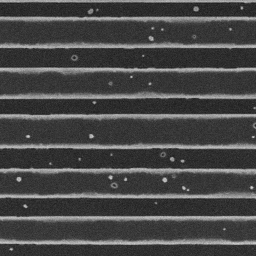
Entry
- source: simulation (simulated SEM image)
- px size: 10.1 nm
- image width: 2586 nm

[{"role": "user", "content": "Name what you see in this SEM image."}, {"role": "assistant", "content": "lines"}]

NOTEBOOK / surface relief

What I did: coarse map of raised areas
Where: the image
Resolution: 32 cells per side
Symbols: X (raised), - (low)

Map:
--------------------------------
--------------------------------
XXXXXXXXXXXXXXXXXXXXXXXXXXXXXXXX
XXXXXXXXXXXXXXXXXXXXXXXXXXXXXXXX
XXXXXXXXXXXXXXXXXXXXXXXXXXXXXXXX
XXXXXXXXXXXXXXXXXXXXXXXXXXXXXXXX
--------------------------------
--------------------------------
--------------------------------
XXXXXXXXXXXXXXXXXXXXXXXXXXXXXXXX
XXXXXXXXXXXXXXXXXXXXXXXXXXXXXXXX
XXXXXXXXXXXXXXXXXXXXXXXXXXXXXXXX
--------------------------------
--------------------------------
X--------X----XXXX--XXXXXXXXXXXX
XXXXXXXXXXXXXXXXXXXXXXXXXXXXXXXX
XXXXXXXXXXXXXXXXXXXXXXXXXXXXXXXX
XXXXXXXXXXXXXXXXXXXXXXXXXXXXXXXX
--------------------------------
--------------------------------
--------------------------------
XXXXXXXXXXXXXXXXXXXXXXXXXXXXXXXX
XXXXXXXXXXXXXXXXXXXXXXXXXXXXXXXX
XXXXXXXXXXXXXXXXXXXXXXXXXXXXXXXX
--XXXXXX-----XXXXXXXXXXXXXXX---X
--------------------------------
--------------------------------
XXXXXXXXXXXXXXXXXXXXXXXXXXXXXXXX
XXXXXXXXXXXXXXXXXXXXXXXXXXXXXXXX
XXXXXXXXXXXXXXXXXXXXXXXXXXXXXXXX
--------------------------------
--------------------------------